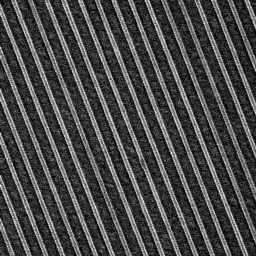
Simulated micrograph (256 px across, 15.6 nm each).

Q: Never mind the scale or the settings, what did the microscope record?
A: parallel lines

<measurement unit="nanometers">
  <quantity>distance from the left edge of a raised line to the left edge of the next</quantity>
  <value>243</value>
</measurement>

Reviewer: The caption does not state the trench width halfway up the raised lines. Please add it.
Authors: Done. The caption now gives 186 nm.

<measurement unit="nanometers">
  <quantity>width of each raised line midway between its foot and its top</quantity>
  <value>52.8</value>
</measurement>